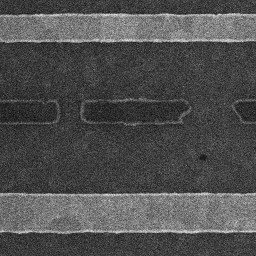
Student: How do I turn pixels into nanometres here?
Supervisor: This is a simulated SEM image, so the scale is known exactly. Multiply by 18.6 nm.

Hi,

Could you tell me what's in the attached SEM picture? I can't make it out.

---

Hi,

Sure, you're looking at one or a few lines or trenches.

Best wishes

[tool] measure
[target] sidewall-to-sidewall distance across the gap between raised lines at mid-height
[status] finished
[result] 1.23 µm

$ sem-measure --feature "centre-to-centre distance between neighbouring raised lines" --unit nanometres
1720